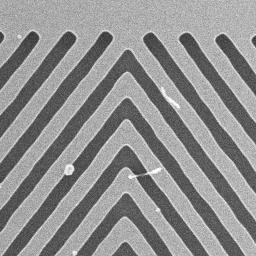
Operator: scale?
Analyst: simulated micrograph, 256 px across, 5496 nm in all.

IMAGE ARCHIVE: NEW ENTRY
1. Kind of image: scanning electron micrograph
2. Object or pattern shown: groups of lines, slits or small figures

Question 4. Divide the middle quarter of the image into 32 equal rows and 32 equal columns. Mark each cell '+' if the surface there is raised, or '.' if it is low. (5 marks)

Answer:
+++....+++++........++++.....+++
++.....++++.........+++++....+++
+.....+++++....++....+++++....++
.....+++++....++++....++++.....+
....+++++....+++++....+++++....+
...+++++.....++++++....+++++....
...++++.....++++++++....+++++...
..+++++....+++++++++.....++++...
.+++++....+++++.+++++....+++++..
+++++.....++++...+++++....+++++.
++++.....++++.....+++++....+++++
++++....+++++......+++++....++++
+++....+++++.......+++++.....+++
++....+++++.........+++++....+++
+....+++++.....++....++++.....++
.....+++++....+++.....++++.....+
....+++++....+++++....+++++....+
...+++++....+++++++....+++++....
...++++....+++++++++....++++....
..++++.....+++++++++....+++++...
.+++++....+++++.+++++....+++++..
+++++....+++++...+++++....+++++.
++++....+++++.....++++.....++++.
+++.....++++.......++++.....++++
++.....+++++.......+++++....++++
++....+++++.........+++++....+++
++....++++....++.....++++....+++
++...++++....++++....+++++....++
....+++++....+++++....+++++....+
...+++++....+++++++....+++++....
..+++++....++++++++.....+++++...
..++++.....+++++++++....+++++...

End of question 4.